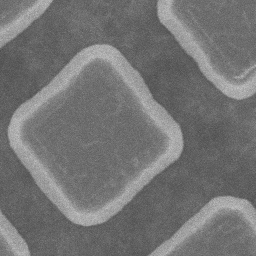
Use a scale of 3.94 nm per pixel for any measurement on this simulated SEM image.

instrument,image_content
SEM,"raised bodies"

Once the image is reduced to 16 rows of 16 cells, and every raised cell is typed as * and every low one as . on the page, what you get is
**........******
*..........*****
............****
.....**.....****
....****.....***
...******.....**
..*******.......
.*********......
.**********.....
.**********.....
..********......
...******.......
....****........
.....*.......***
*..........*****
*.........******